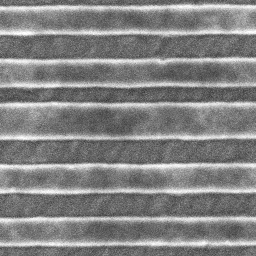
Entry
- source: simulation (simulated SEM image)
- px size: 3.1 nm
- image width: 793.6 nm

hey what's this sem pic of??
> parallel lines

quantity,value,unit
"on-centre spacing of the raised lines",0.164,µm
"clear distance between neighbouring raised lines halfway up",0.0813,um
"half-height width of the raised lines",84.4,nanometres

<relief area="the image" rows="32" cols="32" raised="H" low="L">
LLLLLLLLLLLLLLLLLLLLLLLLLLLLLLLL
HHHHHHHHHHHHHHHHHHHHHHHHHHHHHHHH
HHHHHHHHHHHHHHHHHHHHHHHHHHHHHHHH
HHHHHHHHHHHHHHHHHHHHHHHHHHHHHHHH
LLLLLLLLLLLLLLLLLLLLLLLLLLLLLLLL
LLLLLLLLLLLLLLLLLLLLLLLLLLLLLLLL
LLLLLLLLLLLLLLLLLLLLLLLLLLLLLLLL
HHLLLLLLLLLLLLLLLLLLLHHHHHHHHHHH
HHHHHHHHHHHHHHHHHHHHHHHHHHHHHHHH
HHHHHHHHHHHHHHHHHHHHHHHHHHHHHHHH
HHHHHHHHHHHHHHHHHHHHHHHHHHHHHHHH
LLLLLLLLLLLLLLLLLLLLLLLLLLLLLLLL
LLLLLLLLLLLLLLLLLLLLLLLLLLLLLLLL
HHHHHHHHHHHHHHHHHHHHHHHHHHHHHHHH
HHHHHHHHHHHHHHHHHHHHHHHHHHHHHHHH
HHHHHHHHHHHHHHHHHHHHHHHHHHHHHHHH
HHHHHHHHHHHHHHHHHHHHHHHHHHHHHHHH
LLLLLLLLLLLLLLLLLLLLLLLLLLLLLLLL
LLLLLLLLLLLLLLLLLLLLLLLLLLLLLLLL
LLLLLLLLLLLLLLLLLLLLLLLLLLLLLLLL
LLLLLLLLLLLLLLLLLLLLLLLLLLLLLLLL
HHHHHHHHHHHHHHHHHHHHHHHHHHHHHHHH
HHHHHHHHHHHHHHHHHHHHHHHHHHHHHHHH
HHHHHHHHHHHHHHHHHHHHHHHHHHHHHHHH
LLLLLLLLLLLLLLLLLLLLLLLLLLLLLLLL
LLLLLLLLLLLLLLLLLLLLLLLLLLLLLLLL
LLLLLLLLLLLLLLLLLLLLLLLLLLLLLLLL
HHHHHHHHHHHHHHHHHHHHHHHHHHHHHHHH
HHHHHHHHHHHHHHHHHHHHHHHHHHHHHHHH
HHHHHHHHHHHHHHHHHHHHHHHHHHHHHHHH
HHHHHHHHHHHHHHHHHLLLHHHLHHHHHHHH
LLLLLLLLLLLLLLLLLLLLLLLLLLLLLLLL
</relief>